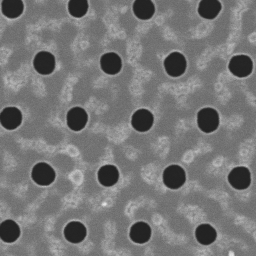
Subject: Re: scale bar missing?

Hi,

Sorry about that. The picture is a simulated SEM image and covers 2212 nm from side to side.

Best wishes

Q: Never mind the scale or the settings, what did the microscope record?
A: a regular array of holes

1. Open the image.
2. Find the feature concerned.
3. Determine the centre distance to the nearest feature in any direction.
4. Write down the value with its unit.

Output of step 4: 0.559 µm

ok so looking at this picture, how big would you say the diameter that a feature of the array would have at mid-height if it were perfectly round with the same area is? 200 nm